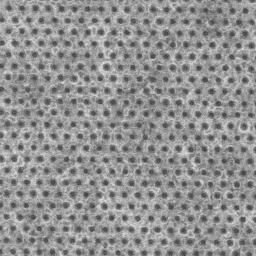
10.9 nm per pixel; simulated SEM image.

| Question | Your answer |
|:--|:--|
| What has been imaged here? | a regular array of raised bodies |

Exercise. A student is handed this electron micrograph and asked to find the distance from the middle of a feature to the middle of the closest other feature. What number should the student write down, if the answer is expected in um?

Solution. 0.0753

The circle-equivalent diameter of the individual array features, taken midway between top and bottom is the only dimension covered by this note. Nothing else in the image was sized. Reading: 68.2 nm